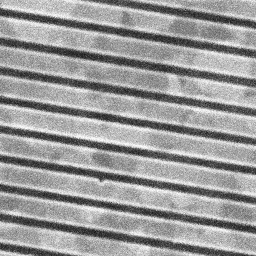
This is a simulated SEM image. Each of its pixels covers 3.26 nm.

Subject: parallel lines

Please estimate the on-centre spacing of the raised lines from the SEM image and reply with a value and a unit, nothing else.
94.3 nm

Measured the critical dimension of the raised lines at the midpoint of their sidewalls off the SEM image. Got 18.7 px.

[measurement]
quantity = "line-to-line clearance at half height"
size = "33 nanometers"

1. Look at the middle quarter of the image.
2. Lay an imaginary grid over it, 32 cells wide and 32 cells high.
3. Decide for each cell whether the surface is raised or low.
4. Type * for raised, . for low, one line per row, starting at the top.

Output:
*************................***
*******************.............
**************************......
..******************************
........************************
...............*****************
*****...............************
***********................*****
*****************...............
************************........
.*****************************..
......**************************
............********************
***...............**************
*********................*******
***************................*
**********************..........
****************************....
......**************************
............********************
*.................**************
*******.................********
**************................**
********************............
**************************......
....****************************
..........**********************
................****************
*****.................**********
*********.**................****
******************..............
************************........